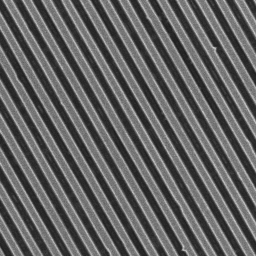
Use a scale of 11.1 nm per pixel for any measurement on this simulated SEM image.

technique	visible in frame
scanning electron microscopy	parallel lines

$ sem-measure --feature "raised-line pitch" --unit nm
187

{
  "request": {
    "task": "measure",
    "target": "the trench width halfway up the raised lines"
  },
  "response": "0.0821 microns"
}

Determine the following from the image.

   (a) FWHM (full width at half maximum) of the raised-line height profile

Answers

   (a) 101 nanometres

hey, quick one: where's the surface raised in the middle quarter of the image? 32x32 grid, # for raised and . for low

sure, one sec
#...##...##..###..###..##...##..
##..###..###..###..##..###..###.
###..##...##...##..###..###..###
.##..###..###..###..##...##...##
.###..###..###..##..###..###..##
..##...##..###..###..###..##...#
..###..###..###..##...##..###..#
#..##...##..###..###..###..###..
#...##..###..###..###..##..###..
##..###..##...##..###..###..###.
##...##..###..###..###..##...##.
###..###..###..###..##..###..###
.###..##...##..###..###..###..##
.###..###..###..###..##...##..##
..###..##...##..###..###..###..#
...##...##..###..###..###..##..#
#..###..###..##...##...##..###..
#...##...##..###..###..###..##..
##..###..###..###..###..##..###.
###..###..##...##..###..###..###
.##..###..###..###..###..##...##
.###..###..##...##..###..###..##
..##...##...##..###..###..###..#
..###..###..###..##...##...##..#
#..##...##...##..###..###..###..
#...##..###..###..###..###..##..
##..###..###..##...##..###..###.
##...##..###..###..###..###..##.
###..###..###..##...##..###..###
.###..##...##...##..###..###..##
..##..###..###..###..##...##...#
..###..##...##...##..###..###..#